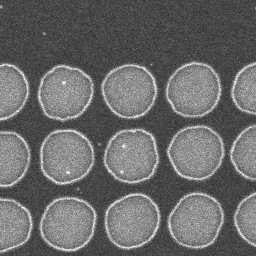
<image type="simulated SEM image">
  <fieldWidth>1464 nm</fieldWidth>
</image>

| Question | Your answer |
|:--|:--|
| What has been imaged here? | a regular array of holes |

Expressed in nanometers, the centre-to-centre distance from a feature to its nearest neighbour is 365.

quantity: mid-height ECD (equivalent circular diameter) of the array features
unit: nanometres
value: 296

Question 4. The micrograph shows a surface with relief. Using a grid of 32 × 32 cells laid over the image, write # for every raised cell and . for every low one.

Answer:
################################
################################
################################
################################
################################
################################
################################
################################
..#####.#######...#####...#####.
...###.....###.....###.....###..
...##......##......##......##...
...##......##......##......##...
...##......##......##......##...
...##......###.....###....####..
.#####...######..###############
################################
########.######...#####....####.
...###.....###.....###......##..
...##......###.....##.......#...
....#.......#.......#.......#...
...##......##.......##.....##...
...###.....###.....###.....###..
..#####..######...##############
################################
################..######..#####.
..#####....###.....###.....###..
...###......#.......##......##..
....#.......#.......#.......#...
....#.......#.......#......###..
...##......###.....###.....###..
...###....#####...#####...######
################################